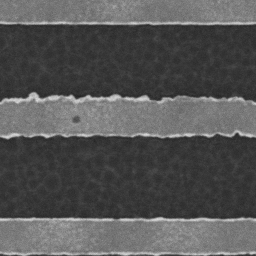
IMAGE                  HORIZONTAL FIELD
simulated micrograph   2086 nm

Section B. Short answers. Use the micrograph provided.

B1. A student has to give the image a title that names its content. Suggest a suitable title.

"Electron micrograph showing one or a few lines or trenches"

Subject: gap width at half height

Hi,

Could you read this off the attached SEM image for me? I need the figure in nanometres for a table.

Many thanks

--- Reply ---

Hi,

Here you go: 651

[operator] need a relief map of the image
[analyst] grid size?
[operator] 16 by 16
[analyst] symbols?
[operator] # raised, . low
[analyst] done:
################
..#....#........
................
................
................
................
################
################
###.#.....#.....
................
................
................
................
................
################
################